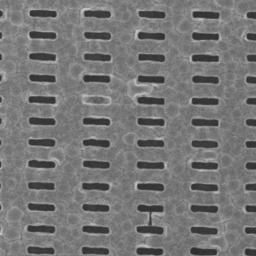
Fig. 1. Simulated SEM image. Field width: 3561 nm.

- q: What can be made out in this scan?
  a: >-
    a regular array of holes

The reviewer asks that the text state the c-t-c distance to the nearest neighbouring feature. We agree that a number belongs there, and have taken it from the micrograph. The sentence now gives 21.5 px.